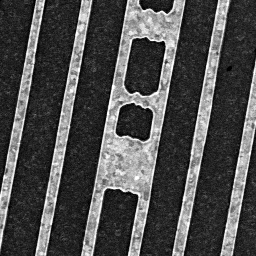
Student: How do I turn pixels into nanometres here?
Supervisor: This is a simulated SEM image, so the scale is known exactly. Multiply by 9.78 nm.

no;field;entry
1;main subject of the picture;parallel lines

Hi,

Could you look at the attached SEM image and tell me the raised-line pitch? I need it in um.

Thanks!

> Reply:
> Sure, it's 0.444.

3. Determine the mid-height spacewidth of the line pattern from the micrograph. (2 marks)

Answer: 36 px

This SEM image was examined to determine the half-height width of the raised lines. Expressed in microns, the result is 0.0962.